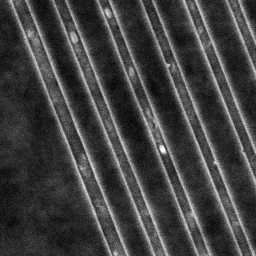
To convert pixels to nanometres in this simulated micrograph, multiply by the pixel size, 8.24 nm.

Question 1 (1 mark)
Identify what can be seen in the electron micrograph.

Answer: parallel lines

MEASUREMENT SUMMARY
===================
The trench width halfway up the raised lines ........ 86.3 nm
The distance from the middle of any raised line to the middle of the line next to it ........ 328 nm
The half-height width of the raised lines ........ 245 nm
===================